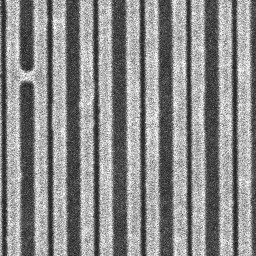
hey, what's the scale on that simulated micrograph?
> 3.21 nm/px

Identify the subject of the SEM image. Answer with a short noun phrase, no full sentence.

parallel lines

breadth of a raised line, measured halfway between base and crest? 43.7 nm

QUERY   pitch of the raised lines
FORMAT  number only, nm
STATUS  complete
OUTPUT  74.1